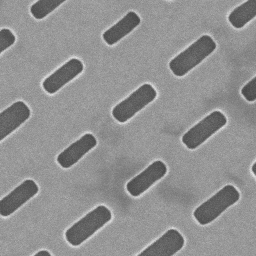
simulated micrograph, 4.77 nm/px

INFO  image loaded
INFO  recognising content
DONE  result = a regular array of holes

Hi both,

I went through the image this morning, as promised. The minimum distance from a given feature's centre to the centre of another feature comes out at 0.356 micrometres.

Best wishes